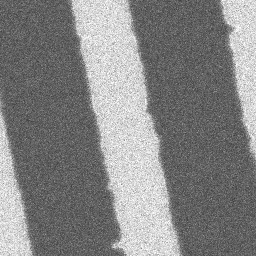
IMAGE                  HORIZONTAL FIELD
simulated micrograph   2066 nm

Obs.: one or a few lines or trenches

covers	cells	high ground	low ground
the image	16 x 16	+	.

+++++...++++++..
+++++...+++++++.
+++++...++++++..
+++++....++++++.
++++++...++++++.
++++++...++++++.
++++++...++++++.
++++++...++++++.
++++++....++++++
.++++++...++++++
.++++++...++++++
.++++++...++++++
.++++++...++++++
.++++++....+++++
..++++++...+++++
..++++++...+++++